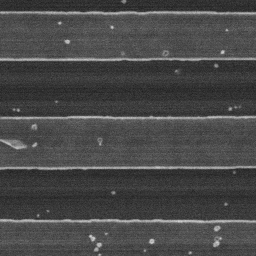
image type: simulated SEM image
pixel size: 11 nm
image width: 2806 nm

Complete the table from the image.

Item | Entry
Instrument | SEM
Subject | lines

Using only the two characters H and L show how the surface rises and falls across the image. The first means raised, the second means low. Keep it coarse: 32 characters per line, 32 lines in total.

LLLLLLLLLLLLLLLLLLLLLLLLLLLLLLLL
LLLLLLLLLLLLLLLLLLLLLLLLLLLLLLLL
HHHHHHHHHHHHHHHHHHHHHHHHHHHHHHHH
HHHHHHHHHHHHHHHHHHHHHHHHHHHHHHHH
HHHHHHHHHHHHHHHHHHHHHHHHHHHHHHHH
HHHHHHHHHHHHHHHHHHHHHHHHHHHHHHHH
HHHHHHHHHHHHHHHHHHHHHHHHHHHHHHHH
HHHHHHHHHHHHHHHLHHLLLLLLLLLLLLLL
LLLLLLLLLLLLLLLLLLLLLLLLLLLLLLLL
LLLLLLLLLLLLLLLLLLLLLLLLLLLLLLLL
LLLLLLLLLLLLLLLLLLLLLLLLLLLLLLLL
LLLLLLLLLLLLLLLLLLLLLLLLLLLLLLLL
LLLLLLLLLLLLLLLLLLLLLLLLLLLLLLLL
LLLLLLLLLLLLLLLLLLLLLLLLLLLLLLLL
LLLLLLLLLLLLLLLLLLLLLLLLLLLLLLLL
HHHHHHHHHHHHHHHHHHHHHHHHHHHHHHHH
HHHHHHHHHHHHHHHHHHHHHHHHHHHHHHHH
HHHHHHHHHHHHHHHHHHHHHHHHHHHHHHHH
HHHHHHHHHHHHHHHHHHHHHHHHHHHHHHHH
HHHHHHHHHHHHHHHHHHHHHHHHHHHHHHHH
HHHHHHHHHHHHHHHHHHHHHHHHHHHHHHHH
LLLLLLLLLLLLLLLLLLLLLLLLLLLLLLLL
LLLLLLLLLLLLLLLLLLLLLLLLLLLLLLLL
LLLLLLLLLLLLLLLLLLLLLLLLLLLLLLLL
LLLLLLLLLLLLLLLLLLLLLLLLLLLLLLLL
LLLLLLLLLLLLLLLLLLLLLLLLLLLLLLLL
LLLLLLLLLLLLLLLLLLLLLLLLLLLLLLLL
HHLHLLLLLLLHLHHLHLLHHLLLLLLLLLLL
HHHHHHHHHHHHHHHHHHHHHHHHHHHHHHHH
HHHHHHHHHHHHHHHHHHHHHHHHHHHHHHHH
HHHHHHHHHHHHHHHHHHHHHHHHHHHHHHHH
HHHHHHHHHHHHHHHHHHHHHHHHHHHHHHHH